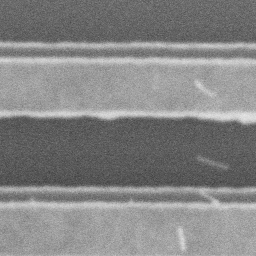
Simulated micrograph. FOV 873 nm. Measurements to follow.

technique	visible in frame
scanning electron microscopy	lines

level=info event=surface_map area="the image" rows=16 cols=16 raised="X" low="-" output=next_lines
----------------
----------------
----------------
XXXXXXXXXXXXXXXX
XXXXXXXXXXXXXXXX
XXXXXXXXXXXXXXXX
XXXXXXXXXXXXXXXX
----------------
----------------
----------------
----------------
----------------
XXXXXXXXXXXXXXXX
XXXXXXXXXXXXXXXX
XXXXXXXXXXXXXXXX
XXXXXXXXXXXXXXXX